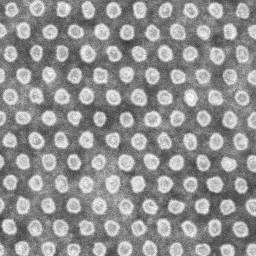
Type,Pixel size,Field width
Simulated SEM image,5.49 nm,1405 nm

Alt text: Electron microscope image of a regular array of raised bodies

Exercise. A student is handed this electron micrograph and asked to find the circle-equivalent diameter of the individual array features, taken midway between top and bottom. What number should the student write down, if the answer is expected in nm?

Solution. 72.5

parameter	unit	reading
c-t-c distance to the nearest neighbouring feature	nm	134